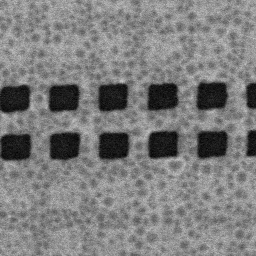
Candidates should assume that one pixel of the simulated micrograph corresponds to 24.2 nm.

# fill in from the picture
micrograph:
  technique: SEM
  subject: a regular array of holes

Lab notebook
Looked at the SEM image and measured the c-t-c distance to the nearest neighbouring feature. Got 1160 nm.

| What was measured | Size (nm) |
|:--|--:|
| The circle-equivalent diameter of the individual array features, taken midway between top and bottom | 768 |